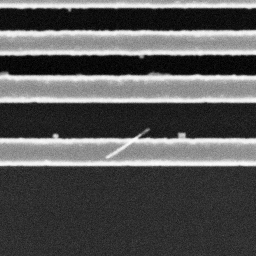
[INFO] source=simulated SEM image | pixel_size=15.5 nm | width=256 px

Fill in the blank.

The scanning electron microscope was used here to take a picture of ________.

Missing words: lines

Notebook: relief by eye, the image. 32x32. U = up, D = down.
UUUUUUUUUUUUUUUUUUUUUUUUUUUUUUUU
DDDDDDDDDDDDDDDDDDDDDDDDDDDDDDDD
DDDDDDDDDDDDDDDDDDDDDDDDDDDDDDDD
DDDDDDDDDDDDDDDDDDDDDDDDDDDDDDDD
UUUUUUUUUUUUUUUUUUUUUUUUUUUUUUUU
UUUUUUUUUUUUUUUUUUUUUUUUUUUUUUUU
UUUUUUUUUUUUUUUUUUUUUUUUUUUUUUUU
DDDDDDDDDDDDDDDDDDDDDDDDDDDDDDDD
DDDDDDDDDDDDDDDDDDDDDDDDDDDDDDDD
UUUUUUUUUUUUUUUUUUUUUUUUUUUUUUUU
UUUUUUUUUUUUUUUUUUUUUUUUUUUUUUUU
UUUUUUUUUUUUUUUUUUUUUUUUUUUUUUUU
UUUUUUUUUUUUUUUUUUUUUUUUUUUUUUUU
DDDDDDDDDDDDDDDDDDDDDDDDDDDDDDDD
DDDDDDDDDDDDDDDDDDDDDDDDDDDDDDDD
DDDDDDDDDDDDDDDDDDDDDDDDDDDDDDDD
DDDDDDDDDDDDDDDDDDDDDDDDDDDDDDDD
UUUUUUUUUUUUUUUUUUUUUUUUUUUUUUUU
UUUUUUUUUUUUUUUUUUUUUUUUUUUUUUUU
UUUUUUUUUUUUUUUUUUUUUUUUUUUUUUUU
UUUUUUUUUUUUUUUUUUUUUUUUUUUUUUUU
DDDDDDDDDDDDDDDDDDDDDDDDDDDDDDDD
DDDDDDDDDDDDDDDDDDDDDDDDDDDDDDDD
DDDDDDDDDDDDDDDDDDDDDDDDDDDDDDDD
DDDDDDDDDDDDDDDDDDDDDDDDDDDDDDDD
DDDDDDDDDDDDDDDDDDDDDDDDDDDDDDDD
DDDDDDDDDDDDDDDDDDDDDDDDDDDDDDDD
DDDDDDDDDDDDDDDDDDDDDDDDDDDDDDDD
DDDDDDDDDDDDDDDDDDDDDDDDDDDDDDDD
DDDDDDDDDDDDDDDDDDDDDDDDDDDDDDDD
DDDDDDDDDDDDDDDDDDDDDDDDDDDDDDDD
DDDDDDDDDDDDDDDDDDDDDDDDDDDDDDDD